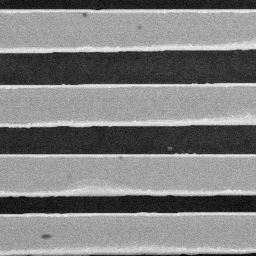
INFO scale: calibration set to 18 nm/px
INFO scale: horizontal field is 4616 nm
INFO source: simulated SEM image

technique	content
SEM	lines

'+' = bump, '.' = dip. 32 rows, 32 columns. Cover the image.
................................
++++++++++++++++++++++++++++++++
++++++++++++++++++++++++++++++++
++++++++++++++++++++++++++++++++
++++++++++++++++++++++++++++++++
++++++++++++++++++++++++++++++++
++++++..........................
................................
................................
................................
.........................+++++++
++++++++++++++++++++++++++++++++
++++++++++++++++++++++++++++++++
++++++++++++++++++++++++++++++++
++++++++++++++++++++++++++++++++
++++++++++++++++++++++++++++....
................................
................................
................................
++++++++++++++++++++++++++++++++
++++++++++++++++++++++++++++++++
++++++++++++++++++++++++++++++++
++++++++++++++++++++++++++++++++
++++++++++++++++++++++++++++++++
................................
................................
................................
++++++++++++++++++++++++++++++++
++++++++++++++++++++++++++++++++
++++++++++++++++++++++++++++++++
++++++++++++++++++++++++++++++++
++++++++++++++++++++++++++++++++